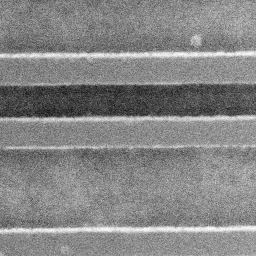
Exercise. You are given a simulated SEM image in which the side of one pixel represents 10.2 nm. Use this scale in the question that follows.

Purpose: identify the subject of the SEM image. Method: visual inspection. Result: lines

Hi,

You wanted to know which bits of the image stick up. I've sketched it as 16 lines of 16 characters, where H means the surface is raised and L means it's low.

LLLLLLLLLLLLLLLL
LLLLLLLLLLLLLLLL
LLLLLLLLLLLLLLLL
HHHHHHHHHHHHHHHH
HHHHHHHHHHHHHHHH
LLLLLLLLLLLLLLLL
LLLLLLLLLLLLLLLL
HHHHHHHHHHHHHHHH
HHHHHHHHHHHHHHHH
LLLLLLLLLLLLLLLL
LLLLLLLLLLLLLLLL
LLLLLLLLLLLLLLLL
LLLLLLLLLLLLLLLL
LLLLLLLLLLLLLLLL
HHHHHHHHHHHHHHHH
HHHHHHHHHHHHHHHH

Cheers